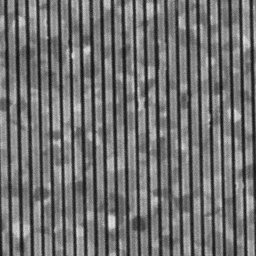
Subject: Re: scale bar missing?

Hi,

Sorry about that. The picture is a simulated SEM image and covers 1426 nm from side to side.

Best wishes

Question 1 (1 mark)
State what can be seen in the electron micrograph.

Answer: parallel lines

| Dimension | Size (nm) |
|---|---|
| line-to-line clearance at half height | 24.4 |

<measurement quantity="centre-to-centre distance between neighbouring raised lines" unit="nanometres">59.5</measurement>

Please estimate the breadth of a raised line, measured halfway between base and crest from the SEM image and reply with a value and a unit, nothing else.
0.0341 micrometres